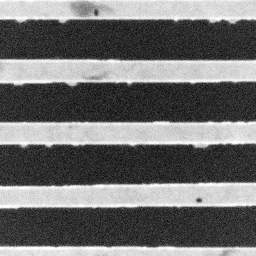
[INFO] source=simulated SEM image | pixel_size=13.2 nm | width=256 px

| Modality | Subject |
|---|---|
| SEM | lines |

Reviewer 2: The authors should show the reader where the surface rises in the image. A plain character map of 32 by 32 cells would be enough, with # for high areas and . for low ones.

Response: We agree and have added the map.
################################
################################
................................
................................
................................
................................
................................
................................
################################
################################
................................
................................
................................
................................
................................
################################
################################
################################
................................
................................
................................
................................
................................
################################
################################
################################
................................
................................
................................
................................
................................
################################